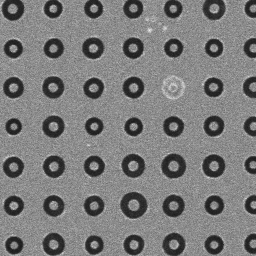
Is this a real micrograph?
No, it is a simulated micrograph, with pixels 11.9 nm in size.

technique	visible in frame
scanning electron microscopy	a regular array of ring-shaped grooves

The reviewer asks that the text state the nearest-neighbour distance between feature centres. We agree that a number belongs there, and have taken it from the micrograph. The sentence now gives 466 nm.